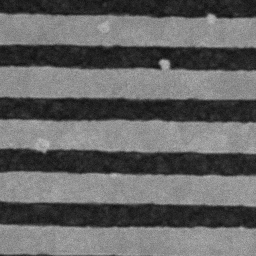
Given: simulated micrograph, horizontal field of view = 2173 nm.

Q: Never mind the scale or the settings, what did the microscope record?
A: lines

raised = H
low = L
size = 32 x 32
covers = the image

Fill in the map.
LLLLLLLHHLLLLLLLLLLLLLLLLLLLLLLL
LLLLLLLHHLLLLLLLLLLLLLLLLLLLLLLL
HHHHHHHHHHHHHHHHHHHHHHHHHHHHHHHH
HHHHHHHHHHHHHHHHHHHHHHHHHHHHHHHH
HHHHHHHHHHHHHHHHHHHHHHHHHHHHHHHH
LLLLLLLLLHHHHHHHHHHHHHHHHHHHHHHH
LLLLLLLLLLLLLLLLLLLLLLLLLLLLLLLL
LLLLLLLLLLLLLLLLHLLLHLLLLLLLLLLL
HHHHHHHLLLLLLLLLLLLLHLLLLLLLLLLL
HHHHHHHHHHHHHHHHHHHHHHHHHHHHHHHH
HHHHHHHHHHHHHHHHHHHHHHHHHHHHHHHH
HHHHHHHHHHHHHHHHHHHHHHHHHHHHHHHH
LLLLLLLLLLLLLLLLLLLLLLLLLLLLLLLL
LLLLLLLLLLLLLLLLLLLLLLLLLLLLLLLL
LLLLLLLLLLLLLLLLLLLLLLLLLLLLLLLL
HHHHHHHHHHHHHHHHHHHHHHHHHHHHHHHH
HHHHHHHHHHHHHHHHHHHHHHHHHHHHHHHH
HHHHHHHHHHHHHHHHHHHHHHHHHHHHHHHH
LHLLHHHHHHHHHHHHHHHHHHHHHHHHHHHH
LLLLLLLLLLLLLLLLLLLLLLLLLLLLLLLL
LLLLLLLLLLLLLLLLLLLLLLLLLLLLLLLL
LLHLLLLLLLLLLLLLLLLLLLLLLLLLLLLL
HHHHHHHHHHHHHHHHHHHHHHHHHHHHHHHH
HHHHHHHHHHHHHHHHHHHHHHHHHHHHHHHH
HHHHHHHHHHHHHHHHHHHHHHHHHHHHHHHH
LLLLLHLLLLLLLLLLLLLLLLLLLHHHHHHH
LLLLLLLLLLLLLLLLLLLLLLLLLLLLLLLL
LLLLLLLLLHLLLLLLLLLLLLLLLLLLLLLL
HHHHHHHHHHHHLLHLHHLHHLLLHHLLLLLL
HHHHHHHHHHHHHHHHHHHHHHHHHHHHHHHH
HHHHHHHHHHHHHHHHHHHHHHHHHHHHHHHH
HHHHHHHHHHHHHHHHHHHHHHHHHHHHHHHH